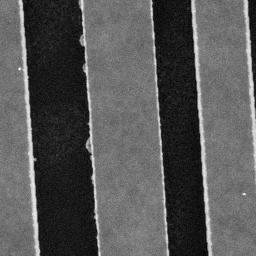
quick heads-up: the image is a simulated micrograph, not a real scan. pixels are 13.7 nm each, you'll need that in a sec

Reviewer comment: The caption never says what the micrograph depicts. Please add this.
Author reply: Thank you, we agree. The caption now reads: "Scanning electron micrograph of lines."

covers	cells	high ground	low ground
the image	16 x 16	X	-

X----XXXXX--XXX-
X----XXXXX--XXXX
XX---XXXXX--XXXX
XX---XXXXX--XXXX
XX---XXXXX--XXXX
XX---XXXXX--XXXX
XX----XXXX--XXXX
XX----XXXX--XXXX
XX----XXXX---XXX
XX----XXXX---XXX
XX----XXXX---XXX
XX----XXXX---XXX
XX----XXXX---XXX
XX----XXXX---XXX
XX----XXXX---XXX
XX----XXXXX--XXX